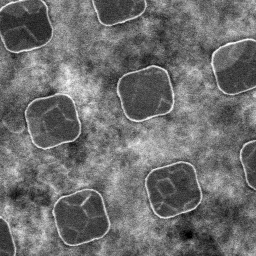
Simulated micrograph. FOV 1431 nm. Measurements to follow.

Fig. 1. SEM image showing raised bodies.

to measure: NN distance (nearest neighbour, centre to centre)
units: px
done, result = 96.6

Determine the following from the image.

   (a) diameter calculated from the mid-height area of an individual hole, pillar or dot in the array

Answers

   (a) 310 nanometers